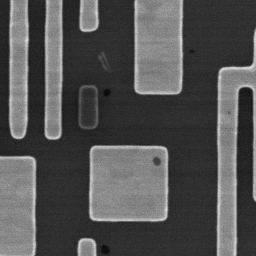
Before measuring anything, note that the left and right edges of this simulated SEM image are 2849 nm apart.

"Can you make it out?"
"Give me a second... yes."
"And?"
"wiring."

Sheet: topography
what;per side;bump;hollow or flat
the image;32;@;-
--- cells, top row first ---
-@@---@@--@@-----@@@@@@---------
-@@---@@--@@-----@@@@@@---------
-@@---@@--@@-----@@@@@@---------
-@@---@@--@@-----@@@@@@---------
-@@---@@---------@@@@@@---------
-@@---@@---------@@@@@@---------
-@@---@@---------@@@@@@---------
-@@---@@---------@@@@@@---------
-@@---@@---------@@@@@@-----@@@@
-@@---@@---------@@@@@@----@@@@@
-@@---@@---------@@@@@@----@@@@@
-@@---@@--@@-----@@@@@-----@@@--
-@@---@@--@@---------------@@@--
-@@---@@--@@---------------@@@--
-@@---@@--@@---------------@@@--
-@@---@@--@@---------------@@@--
-@@---@@-------------------@@@--
---------------------------@@@--
------------@@@@@@@@-------@@@--
-----------@@@@@@@@@@------@@@--
@@@@-------@@@@@@@@@@------@@---
@@@@-------@@@@@@@@@@------@@---
@@@@-------@@@@@@@@@@------@@@--
@@@@-------@@@@@@@@@@------@@@--
@@@@-------@@@@@@@@@@------@@@--
@@@@-------@@@@@@@@@@------@@@--
@@@@-------@@@@@@@@@@------@@@--
@@@@--------@@@@@@@@-------@@@--
@@@@-----------------------@@@--
@@@@-----------------------@@@--
@@@@------@@---------------@@@--
@@@@------@@---------------@@---